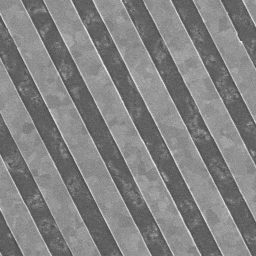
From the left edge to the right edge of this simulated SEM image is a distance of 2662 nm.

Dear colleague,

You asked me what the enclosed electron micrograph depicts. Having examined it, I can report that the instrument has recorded parallel lines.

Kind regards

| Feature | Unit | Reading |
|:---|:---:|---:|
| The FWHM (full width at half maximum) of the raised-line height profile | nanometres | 257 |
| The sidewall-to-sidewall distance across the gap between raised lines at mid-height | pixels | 19.4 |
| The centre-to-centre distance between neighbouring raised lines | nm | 463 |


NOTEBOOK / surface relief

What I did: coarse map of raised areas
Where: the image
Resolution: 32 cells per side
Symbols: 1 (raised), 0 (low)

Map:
11100011100011100011110011110001
11100011110011110001110001110001
11110001110001110001111001111000
01110001111001111000111000111000
01111000111000111000111100111100
00111000111100111100011100011100
00111100011100011100011110011110
00011100011110011110001110001110
10011110001110001110001111001111
10001110001111001111000111000111
11001111000111000111000111100111
11000111000111100111100011100011
11100111100011100011110011110011
11100011110011110011110001110001
11110011110001110001111001111001
01110001111001111001111000111000
01111001111000111000111100111100
00111000111100111100011100011100
00111100011100011100011110011110
00011100011110011110001110001110
10011110001110001110001111001111
10001110001111001111000111000111
11001111000111000111000111100111
11000111000111100111100011100011
11100111100011100011100011110011
11100011100011110011110001110001
11110011110001110001110001111001
01110001110001111001111000111000
01111001111000111000111000111100
00111000111000111100111100011100
00111100111100011100011100011110
00011100011100011110011110001110